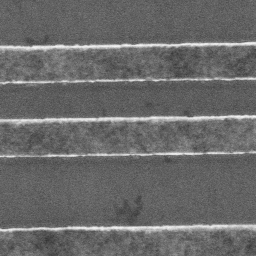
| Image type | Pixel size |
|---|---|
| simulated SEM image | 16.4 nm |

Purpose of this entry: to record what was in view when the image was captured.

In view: lines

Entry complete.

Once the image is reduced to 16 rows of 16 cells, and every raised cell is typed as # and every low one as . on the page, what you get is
................
................
................
################
################
................
................
.....###########
################
################
................
................
................
................
################
################